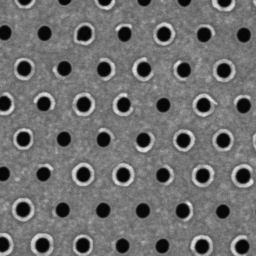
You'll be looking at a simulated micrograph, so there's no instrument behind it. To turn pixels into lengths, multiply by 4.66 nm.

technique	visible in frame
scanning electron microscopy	a regular array of holes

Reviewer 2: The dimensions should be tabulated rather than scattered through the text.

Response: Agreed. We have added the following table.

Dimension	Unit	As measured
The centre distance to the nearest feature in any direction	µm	0.185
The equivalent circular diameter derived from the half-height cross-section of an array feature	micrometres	0.0639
